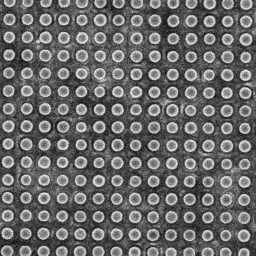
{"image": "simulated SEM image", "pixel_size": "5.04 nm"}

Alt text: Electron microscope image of a regular array of raised bodies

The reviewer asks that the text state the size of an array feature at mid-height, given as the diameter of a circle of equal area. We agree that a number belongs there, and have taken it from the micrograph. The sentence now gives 55.8 nm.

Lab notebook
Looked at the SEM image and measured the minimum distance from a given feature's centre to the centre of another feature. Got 89.5 nm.